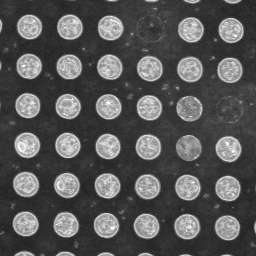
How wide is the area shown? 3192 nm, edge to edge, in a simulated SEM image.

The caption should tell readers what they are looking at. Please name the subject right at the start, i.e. a regular array of raised bodies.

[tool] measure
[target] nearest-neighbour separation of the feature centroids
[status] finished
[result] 490 nanometers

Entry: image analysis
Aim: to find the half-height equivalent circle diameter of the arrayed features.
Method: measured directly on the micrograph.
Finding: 25.2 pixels